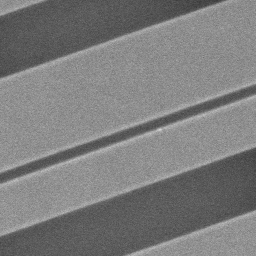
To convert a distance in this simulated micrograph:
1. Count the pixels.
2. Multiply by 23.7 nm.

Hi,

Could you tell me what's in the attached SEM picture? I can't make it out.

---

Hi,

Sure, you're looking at lines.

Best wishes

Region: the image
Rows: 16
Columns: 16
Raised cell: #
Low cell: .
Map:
#............###
..........######
.......#########
....############
.###############
################
################
################
################
###############.
############....
#########.......
######..........
####...........#
#...........####
.........#######